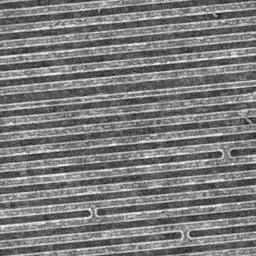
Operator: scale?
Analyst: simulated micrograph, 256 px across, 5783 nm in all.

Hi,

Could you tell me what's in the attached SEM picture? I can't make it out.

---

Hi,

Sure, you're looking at parallel lines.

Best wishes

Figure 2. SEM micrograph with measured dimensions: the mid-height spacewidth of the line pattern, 177 nm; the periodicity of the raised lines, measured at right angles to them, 345 nm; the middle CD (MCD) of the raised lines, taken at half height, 157 nanometres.